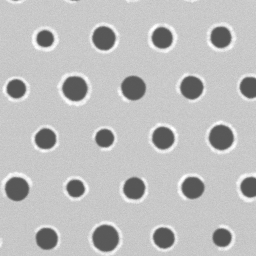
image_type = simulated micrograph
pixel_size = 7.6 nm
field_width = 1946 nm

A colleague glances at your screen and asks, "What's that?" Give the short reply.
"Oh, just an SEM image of a regular array of holes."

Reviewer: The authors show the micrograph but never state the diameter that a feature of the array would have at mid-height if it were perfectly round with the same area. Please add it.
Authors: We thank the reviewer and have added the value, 168 nanometers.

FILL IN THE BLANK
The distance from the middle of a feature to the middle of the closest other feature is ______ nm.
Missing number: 439